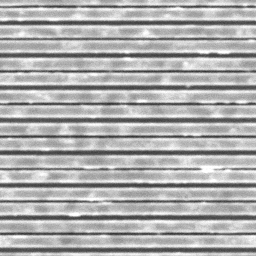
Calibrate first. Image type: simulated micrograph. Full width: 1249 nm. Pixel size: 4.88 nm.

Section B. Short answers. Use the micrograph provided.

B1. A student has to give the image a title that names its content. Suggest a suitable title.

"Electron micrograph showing parallel lines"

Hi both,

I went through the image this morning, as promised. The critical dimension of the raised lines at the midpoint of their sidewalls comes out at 57.3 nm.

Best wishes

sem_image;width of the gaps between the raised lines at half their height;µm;0.0268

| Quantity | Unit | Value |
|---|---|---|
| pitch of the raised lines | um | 0.0791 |